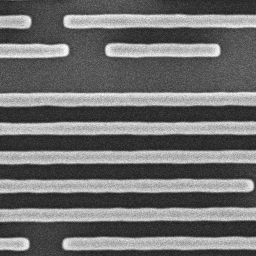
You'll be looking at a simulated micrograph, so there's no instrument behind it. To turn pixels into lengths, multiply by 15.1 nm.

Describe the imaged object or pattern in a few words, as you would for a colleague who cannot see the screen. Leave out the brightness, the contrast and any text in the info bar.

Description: groups of lines, slits or small figures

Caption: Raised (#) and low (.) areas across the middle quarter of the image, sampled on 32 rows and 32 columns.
................................
................................
................................
................................
................................
................................
................................
###....######.##################
################################
################################
................................
................................
................................
................................
................................
################################
################################
#########........#########......
................................
................................
................................
................................
################################
################################
################################
................................
................................
................................
................................
################################
################################
################################